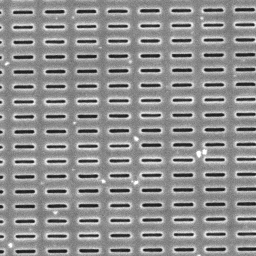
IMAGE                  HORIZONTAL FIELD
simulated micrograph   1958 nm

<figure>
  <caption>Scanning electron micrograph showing a regular array of holes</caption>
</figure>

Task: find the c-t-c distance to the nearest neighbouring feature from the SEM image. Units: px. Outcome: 14.7